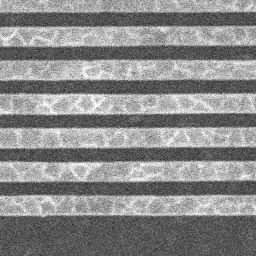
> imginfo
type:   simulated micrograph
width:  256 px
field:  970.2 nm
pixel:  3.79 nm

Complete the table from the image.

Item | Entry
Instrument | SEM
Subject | parallel lines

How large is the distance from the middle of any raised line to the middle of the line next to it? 128 nm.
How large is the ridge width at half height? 68.7 nanometres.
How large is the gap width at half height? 58.3 nm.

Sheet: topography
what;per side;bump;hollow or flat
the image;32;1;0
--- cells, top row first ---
11111111111111111111111111111111
00000000000000000000000000000000
00000000000000000000000000000000
11100011110011001111111111111111
11111111111111111111111111111111
11111111111111111111111111111111
00000000000000000000000000000000
00000000000000000000000000000000
11111111111111111111111111111111
11111111111111111111111111111111
00000000000000000000000000000000
00000000000000000000000000000000
11111111111111111111111111111111
11111111111111111111111111111111
00000000000000000000000000000000
00000000000000000000000000000000
11111111111111111111111111111111
11111111111111111111111111111111
00000000000000000000000000000000
00000000000000000000000000000000
11111111000011111111111111111111
11111111111111111111111111111111
11111111111111111111000000000000
00000000000000000000000000000000
00000000000000000000000000000001
11111111111111111111111111111111
11111111111111111111111111111111
00000000000000000000000000000000
00000000000000000000000000000000
00000000000000000000000000000000
00000000000000000000000000000000
00000000000000000000000000000000